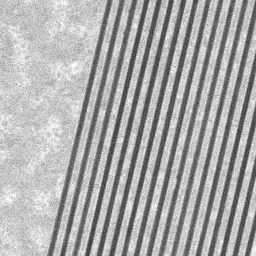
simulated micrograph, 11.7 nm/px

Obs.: parallel lines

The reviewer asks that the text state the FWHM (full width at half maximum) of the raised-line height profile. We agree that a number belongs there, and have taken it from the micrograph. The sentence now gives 76.9 nanometers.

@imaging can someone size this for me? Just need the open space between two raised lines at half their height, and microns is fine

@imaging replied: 0.0555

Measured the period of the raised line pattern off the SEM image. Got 140 nanometers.